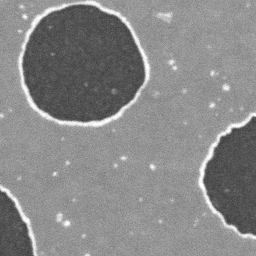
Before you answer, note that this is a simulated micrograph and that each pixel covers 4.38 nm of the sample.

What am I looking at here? holes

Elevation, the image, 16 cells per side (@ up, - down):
@@@@--@@@@@@@@@@
@@------@@@@@@@@
@@------@@@@@@@@
@--------@@@@@@@
@--------@@@@@@@
@@-------@@@@@@@
@@------@@@@@@@@
@@@@---@@@@@@@@@
@@@@@@@@@@@@@@--
@@@@@@@@@@@@@---
@@@@@@@@@@@@@---
@@@@@@@@@@@@@---
-@@@@@@@@@@@@---
-@@@@@@@@@@@@@--
--@@@@@@@@@@@@@-
--@@@@@@@@@@@@@@